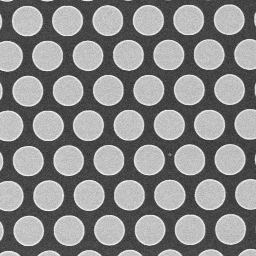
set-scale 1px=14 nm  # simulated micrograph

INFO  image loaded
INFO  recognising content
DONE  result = an array of small figures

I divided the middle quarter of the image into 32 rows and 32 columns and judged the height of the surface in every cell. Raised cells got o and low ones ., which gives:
...oooooo....oooooo.....ooooo...
.....oo.........o...............
................................
ooo......oooo......ooooo.....ooo
oooo....oooooo....oooooo....oooo
oooo...oooooooo...ooooooo...oooo
ooooo..oooooooo..oooooooo...oooo
ooooo..oooooooo...ooooooo...oooo
oooo....oooooo....oooooo....oooo
oooo.....ooooo.....ooooo.....ooo
................................
................................
....ooooo.....ooooo.....ooooo...
...oooooo....oooooo....ooooooo..
..oooooooo...ooooooo...ooooooo..
..oooooooo...ooooooo...ooooooo..
..oooooooo...ooooooo...ooooooo..
...oooooo....oooooo....oooooo...
....oooo......ooooo.....oooo....
................................
oo........oo........ooo.......oo
oooo....oooooo....oooooo.....ooo
ooooo...ooooooo...ooooooo...oooo
ooooo...ooooooo...ooooooo...oooo
ooooo...ooooooo...ooooooo...oooo
ooooo...ooooooo...ooooooo...oooo
oooo....oooooo....oooooo.....ooo
ooo.......ooo.......ooo.......oo
................................
.....ooo......oooo......oooo....
...oooooo....oooooo....ooooooo..
...ooooooo...ooooooo...ooooooo..